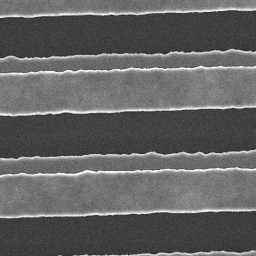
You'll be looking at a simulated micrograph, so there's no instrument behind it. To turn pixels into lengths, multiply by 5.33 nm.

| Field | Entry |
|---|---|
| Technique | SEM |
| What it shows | lines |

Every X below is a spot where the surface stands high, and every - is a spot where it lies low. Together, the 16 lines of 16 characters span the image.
XXXXXXXXXXXXXXXX
----------------
----------------
-----XXXXXXXXXXX
XXXXXXXXXXXXXXXX
XXXXXXXXXXXXXXXX
XXXXXXXXXXXXXXXX
----------------
----------------
---------------X
XXXXXXXXXXXXXXXX
XXXXXXXXXXXXXXXX
XXXXXXXXXXXXXXXX
XXXXX-----------
----------------
----------------